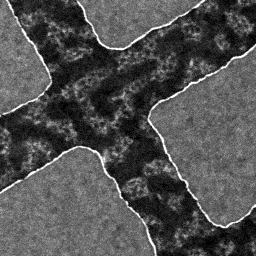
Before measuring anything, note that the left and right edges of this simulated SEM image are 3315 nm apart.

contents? raised bodies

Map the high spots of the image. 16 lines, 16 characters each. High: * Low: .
*....*******....
*.....*****.....
**....***.......
**.............*
***..........***
***.........****
**........******
.........*******
..........******
....**....******
...****....*****
.******.....****
********....****
*********....**.
*********.......
**********......